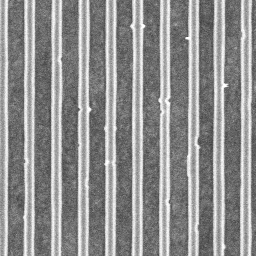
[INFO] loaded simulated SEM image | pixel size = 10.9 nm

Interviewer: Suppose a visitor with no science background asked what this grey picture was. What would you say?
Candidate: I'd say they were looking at parallel lines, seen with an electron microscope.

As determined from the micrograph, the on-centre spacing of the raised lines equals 0.294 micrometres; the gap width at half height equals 17.9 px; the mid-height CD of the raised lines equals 8.88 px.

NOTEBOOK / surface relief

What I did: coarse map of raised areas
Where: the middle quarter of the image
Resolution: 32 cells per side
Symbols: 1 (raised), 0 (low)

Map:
00001100000110000110000011000001
00001100000110000110000011000001
00001100000110000110000011000001
00001100000110000110000011000001
00001100000110000110000011000001
00001100000110000110000011000001
00001100000110000110000011000001
00001100000110000110000011000001
00001100000110000110000011000001
00001100000110000110000011000001
00001100000110000110000011000001
00001100000110000110000011000001
00001100000110000110000011000001
00001100000110000110000011000001
00001100000110000110000011000001
00001100001110000110000011000001
00001100001110000110000011000001
00001100000110000110000011000001
00001100000110000110000011000001
00001100000110000110000011000001
00001100000110000110000011000001
00001100000110000110000011000001
00001100000110000110000011000001
00001100000110000111000011000001
00001100000110000111000011000001
00001100001110000110000011000001
00001100000110000110000011000001
00001100000110000110000011000001
00001100000110000110000011000001
00001100000110000110000011000001
00001100000110000110000011000001
00001100000110000110000011000001